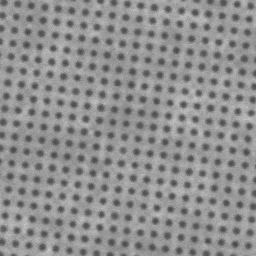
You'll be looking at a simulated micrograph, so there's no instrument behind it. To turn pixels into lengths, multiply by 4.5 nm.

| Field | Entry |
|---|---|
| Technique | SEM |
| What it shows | a regular array of holes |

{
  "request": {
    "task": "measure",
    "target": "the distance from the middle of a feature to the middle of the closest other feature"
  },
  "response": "58.9 nanometers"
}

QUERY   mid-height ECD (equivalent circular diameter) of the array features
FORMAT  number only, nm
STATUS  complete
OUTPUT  31.7